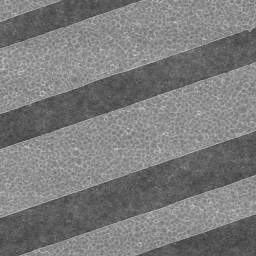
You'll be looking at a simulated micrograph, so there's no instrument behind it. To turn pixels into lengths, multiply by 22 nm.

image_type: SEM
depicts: one or a few lines or trenches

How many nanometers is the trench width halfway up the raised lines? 761